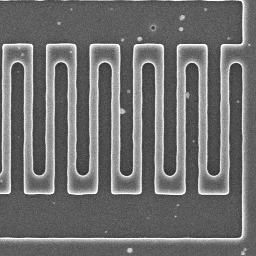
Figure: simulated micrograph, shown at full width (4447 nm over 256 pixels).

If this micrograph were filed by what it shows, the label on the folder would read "groups of lines, slits or small figures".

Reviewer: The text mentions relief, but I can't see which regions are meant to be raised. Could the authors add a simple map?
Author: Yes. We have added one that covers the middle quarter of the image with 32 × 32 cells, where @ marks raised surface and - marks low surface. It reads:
-@@----@@---@@---@@@---@@---@@@-
-@@----@----@@---@@----@@---@@--
-@@----@----@@---@@----@@---@@--
-@@----@----@@---@@----@@---@@--
-@@----@----@@---@@----@@---@@--
-@@----@----@@---@@----@@---@@--
-@@----@----@@---@@----@@---@@--
-@@---@@----@@---@@----@@---@@--
-@@---@@----@@---@@----@@---@@--
-@@---@@----@@---@@----@@---@@--
-@@---@@----@@---@@----@@---@@--
-@@---@@----@@---@@----@@---@@--
-@@---@@----@@---@@----@@---@@--
-@@---@@----@@---@@----@@---@@--
-@@---@@----@@---@@----@@---@@--
-@@---@@----@@---@@----@@---@@--
-@@---@@----@@---@@----@@---@@--
-@@----@----@@---@@----@@---@@--
-@@----@----@@---@@----@@---@@--
-@@----@----@@---@@----@@---@@--
-@@---@@----@@---@@----@@---@@--
-@@---@@----@@---@@----@@---@@--
-@@----@----@@---@@----@@---@@--
-@@----@----@@---@@----@@---@@--
-@@---@@----@@---@@----@@---@@--
-@@---@@----@@---@@----@@---@@--
-@@---@@----@@---@@----@@---@@--
-@@@--@@----@@---@@----@@---@@--
-@@@@@@@----@@@@@@@----@@@@@@@--
-@@@@@@@----@@@@@@@----@@@@@@@--
-@@@@@@@----@@@@@@@----@@@@@@@--
-@@@@@@@----@@@@@@@----@@@@@@@--